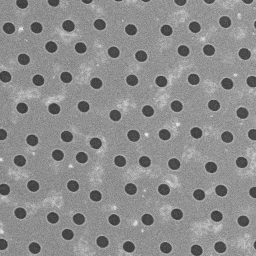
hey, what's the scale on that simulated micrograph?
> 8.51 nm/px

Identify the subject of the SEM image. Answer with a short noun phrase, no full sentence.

a regular array of holes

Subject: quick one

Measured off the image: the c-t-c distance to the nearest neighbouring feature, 227 nanometres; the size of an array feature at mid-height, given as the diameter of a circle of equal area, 101 nanometers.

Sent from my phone